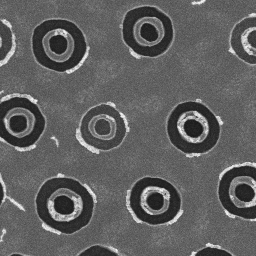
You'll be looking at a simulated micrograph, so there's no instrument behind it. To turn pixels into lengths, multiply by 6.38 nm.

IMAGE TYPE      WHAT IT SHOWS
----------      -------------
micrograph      ring-shaped grooves with a dot in the middle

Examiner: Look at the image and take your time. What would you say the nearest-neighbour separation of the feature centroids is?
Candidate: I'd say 572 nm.